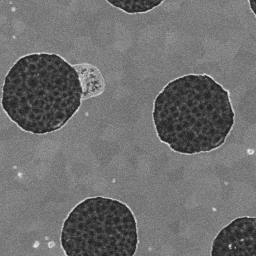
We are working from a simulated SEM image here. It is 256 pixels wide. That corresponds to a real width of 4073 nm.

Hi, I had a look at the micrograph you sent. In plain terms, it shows holes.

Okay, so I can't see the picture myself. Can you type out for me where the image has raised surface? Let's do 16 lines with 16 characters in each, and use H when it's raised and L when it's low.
HHHHHHHLLLHHHHHH
HHHHHHHHHHHHHHHH
HHHHHHHHHHHHHHHH
HHLLHHHHHHHHHHHH
HLLLLLHHHHHHHHHH
LLLLLLHHHHLLLLHH
LLLLLHHHHHLLLLHH
HLLLHHHHHHLLLLLH
HHHHHHHHHHLLLLHH
HHHHHHHHHHHLLHHH
HHHHHHHHHHHHHHHH
HHHHHHHHHHHHHHHH
HHHHHLLHHHHHHHHH
HHHHLLLLHHHHHHHH
HHHHLLLLLHHHHHLL
HHHHLLLLHHHHHLLL